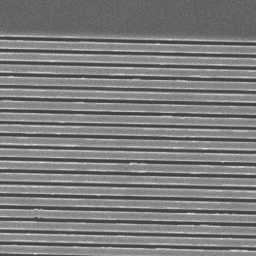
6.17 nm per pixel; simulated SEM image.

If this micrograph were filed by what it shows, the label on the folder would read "parallel lines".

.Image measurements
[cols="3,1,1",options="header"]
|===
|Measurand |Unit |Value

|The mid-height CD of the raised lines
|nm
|50.1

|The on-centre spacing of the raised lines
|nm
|74.3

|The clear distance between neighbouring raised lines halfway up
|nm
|22.4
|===